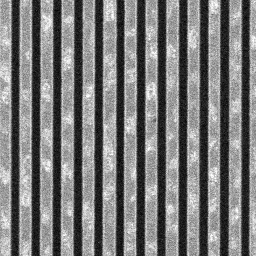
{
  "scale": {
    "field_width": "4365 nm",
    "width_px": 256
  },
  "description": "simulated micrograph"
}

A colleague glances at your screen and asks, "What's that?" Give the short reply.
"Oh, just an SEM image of parallel lines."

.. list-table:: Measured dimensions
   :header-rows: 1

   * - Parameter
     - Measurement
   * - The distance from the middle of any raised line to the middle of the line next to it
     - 357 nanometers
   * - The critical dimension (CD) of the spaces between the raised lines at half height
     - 9.5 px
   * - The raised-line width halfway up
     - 196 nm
